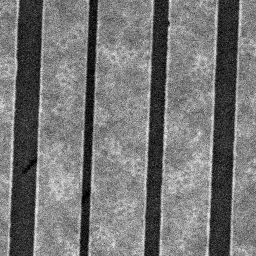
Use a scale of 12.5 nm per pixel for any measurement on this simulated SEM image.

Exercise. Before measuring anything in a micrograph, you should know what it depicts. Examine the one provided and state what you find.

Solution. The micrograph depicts one or a few lines or trenches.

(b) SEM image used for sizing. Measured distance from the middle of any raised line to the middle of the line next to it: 797 nm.